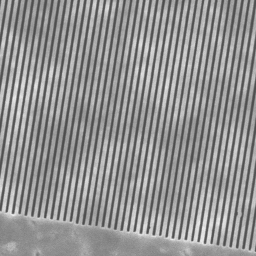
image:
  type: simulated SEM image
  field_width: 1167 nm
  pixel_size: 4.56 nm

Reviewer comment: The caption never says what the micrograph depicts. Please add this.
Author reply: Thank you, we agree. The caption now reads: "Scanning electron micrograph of parallel lines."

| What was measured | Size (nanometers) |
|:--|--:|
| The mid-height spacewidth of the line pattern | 11.8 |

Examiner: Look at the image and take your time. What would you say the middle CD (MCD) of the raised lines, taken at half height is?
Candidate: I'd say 16.4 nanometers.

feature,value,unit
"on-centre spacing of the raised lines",29.6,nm